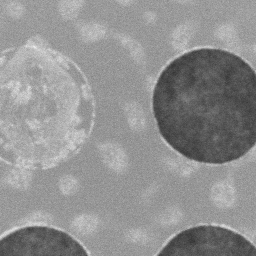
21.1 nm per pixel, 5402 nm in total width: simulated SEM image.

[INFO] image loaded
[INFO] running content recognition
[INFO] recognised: holes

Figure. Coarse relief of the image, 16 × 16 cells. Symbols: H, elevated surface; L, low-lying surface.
HHHHHHHHHHHHHHHH
HHHHHHHHHHHHHHHH
HHHHHHHHHHHHHHHH
HHHHHHHHHHHLLLLH
HHHHHHHHHHLLLLLL
HHHHHHHHHHLLLLLL
HHHHHHHHHHLLLLLL
HHHHHHHHHHLLLLLL
HHHHHHHHHHLLLLLL
HHHHHHHHHHHLLLLH
HHHHHHHHHHHHHHHH
HHHHHHHHHHHHHHHH
HHHHHHHHHHHHHHHH
HHHHHHHHHHHHHHHH
HLLLHHHHHHHLLLLH
LLLLLHHHHHLLLLLL